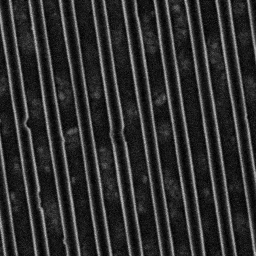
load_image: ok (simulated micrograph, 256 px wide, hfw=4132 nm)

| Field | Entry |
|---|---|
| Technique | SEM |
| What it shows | parallel lines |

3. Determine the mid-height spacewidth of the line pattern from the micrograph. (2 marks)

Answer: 299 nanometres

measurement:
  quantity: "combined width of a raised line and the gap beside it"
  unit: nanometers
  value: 499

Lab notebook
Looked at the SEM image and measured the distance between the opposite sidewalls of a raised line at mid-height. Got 202 nanometres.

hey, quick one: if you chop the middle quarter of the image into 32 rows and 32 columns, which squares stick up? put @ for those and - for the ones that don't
--@@@----@@@-----@@@-----@@@----
--@@@-----@@@----@@@@----@@@----
--@@@-----@@@-----@@@----@@@----
--@@@-----@@@-----@@@----@@@----
--@@@-----@@@-----@@@-----@@@---
--@@@-----@@@-----@@@-----@@@---
--@@@-----@@@-----@@@-----@@@---
---@@@----@@@-----@@@-----@@@---
---@@@-----@@@----@@@@----@@@---
---@@@-----@@@-----@@@----@@@---
---@@@-----@@@-----@@@-----@@@--
---@@@-----@@@-----@@@-----@@@--
---@@@-----@@@-----@@@-----@@@--
---@@@-----@@@@----@@@-----@@@--
----@@@----@@@@----@@@-----@@@--
----@@@-----@@@-----@@-----@@@--
----@@@-----@@@-----@@@----@@@--
----@@@-----@@@-----@@@-----@@@-
----@@@-----@@@-----@@@-----@@@-
----@@@-----@@@-----@@@-----@@@-
-----@@@----@@@@----@@@-----@@@-
-----@@@-----@@@----@@@-----@@@-
-----@@@-----@@@-----@@@----@@@@
-----@@@-----@@@-----@@@----@@@@
@----@@@-----@@@-----@@@-----@@@
@----@@@-----@@@-----@@@-----@@@
@----@@@-----@@@-----@@@-----@@@
@-----@@@----@@@@----@@@-----@@@
@-----@@@-----@@@----@@@-----@@@
@-----@@@-----@@@-----@@@----@@@
@-----@@@-----@@@-----@@@-----@@
@@----@@@-----@@@-----@@@-----@@